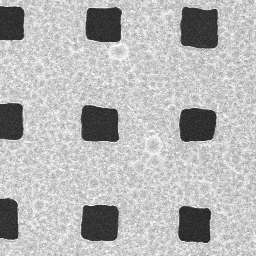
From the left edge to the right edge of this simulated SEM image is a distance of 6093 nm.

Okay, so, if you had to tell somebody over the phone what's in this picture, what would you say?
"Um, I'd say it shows holes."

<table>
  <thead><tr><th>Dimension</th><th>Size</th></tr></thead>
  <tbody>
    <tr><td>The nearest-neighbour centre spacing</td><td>2270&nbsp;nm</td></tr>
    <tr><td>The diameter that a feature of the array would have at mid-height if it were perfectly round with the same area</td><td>933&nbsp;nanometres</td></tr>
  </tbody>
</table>